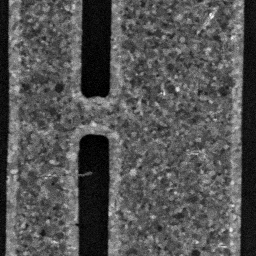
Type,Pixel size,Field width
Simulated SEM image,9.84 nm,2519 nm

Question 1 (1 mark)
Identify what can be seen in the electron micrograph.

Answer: one or a few lines or trenches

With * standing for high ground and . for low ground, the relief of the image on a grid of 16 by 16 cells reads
.****..********.
.****..********.
.****..********.
.****..********.
.****..********.
.****..********.
.**************.
.**************.
.****..********.
.****..********.
.****..********.
.****..********.
.****..********.
.****..********.
.****..********.
.****..********.